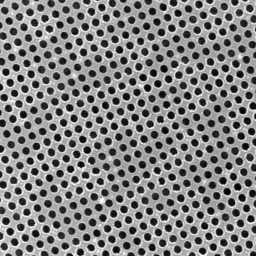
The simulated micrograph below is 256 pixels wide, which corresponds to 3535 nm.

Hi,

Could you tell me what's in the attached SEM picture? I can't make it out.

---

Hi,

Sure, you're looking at a regular array of holes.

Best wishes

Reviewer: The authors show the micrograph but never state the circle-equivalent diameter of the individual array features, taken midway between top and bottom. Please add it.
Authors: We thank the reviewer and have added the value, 116 nm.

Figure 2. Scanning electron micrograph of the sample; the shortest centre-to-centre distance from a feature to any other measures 155 nm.